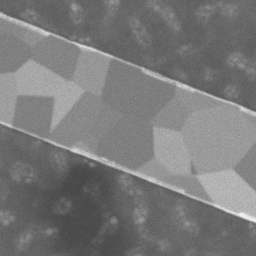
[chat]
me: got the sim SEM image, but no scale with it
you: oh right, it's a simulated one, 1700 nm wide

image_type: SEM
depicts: one or a few lines or trenches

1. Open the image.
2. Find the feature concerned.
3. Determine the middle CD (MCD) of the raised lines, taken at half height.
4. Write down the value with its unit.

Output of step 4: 676 nm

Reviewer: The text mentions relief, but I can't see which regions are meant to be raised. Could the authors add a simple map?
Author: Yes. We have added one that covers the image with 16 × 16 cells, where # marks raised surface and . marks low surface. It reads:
................
##..............
####............
#######.........
##########......
############....
###############.
################
..##############
.....###########
.......#########
..........######
.............###
...............#
................
................